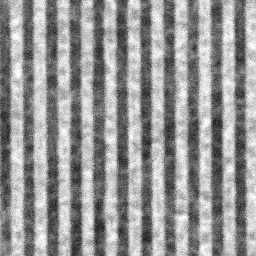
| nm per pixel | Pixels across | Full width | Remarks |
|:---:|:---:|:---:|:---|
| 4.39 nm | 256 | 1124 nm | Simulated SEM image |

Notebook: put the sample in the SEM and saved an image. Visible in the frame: parallel lines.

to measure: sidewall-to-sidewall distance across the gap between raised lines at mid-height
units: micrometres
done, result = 0.0592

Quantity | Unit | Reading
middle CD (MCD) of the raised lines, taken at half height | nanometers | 43.9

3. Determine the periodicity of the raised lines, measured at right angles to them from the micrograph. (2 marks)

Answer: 103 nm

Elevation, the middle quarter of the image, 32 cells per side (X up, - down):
X----XX---XXX---XXX---XXX---XXX-
X----XX---XXX---XXX---XXX---XXX-
X----XX---XXX---XXX---XXX---XXX-
X----XX---XXX---XXX---XXX---XXX-
X----XX---XXX---XXX---XXX---XXX-
X----XX---XXX---XXX---XXX---XXX-
X----XX---XXX---XXX---XXX---XXX-
X----XX---XXX---XXX---XXX---XXX-
X----XX---XXX---XXX---XXX---XXX-
X----XX---XXX---XXX---XXX---XXX-
X----XX---XXX---XXX---XXX---XXX-
X----XX---XXX---XXX---XXX---XXX-
X----XX----XX---XXX---XXX---XXX-
X----XX----XX---XXX---XXX---XX--
X----XX----XX---XXX---XXX---XX--
X----XX----XX---XXX---XXX---XX--
X----XX----XX---XXX---XXX---XX--
X----XX----XX---XXX---XXX---XX--
X----XX----XX---XXX---XXX---XX--
X----XX----XX---XXX---XXX---XX--
X----XX----XX---XXX---XXX---XX--
X----XX----XX---XXX---XXX---XX--
X----XX----XX---XXX---XXX---XX--
X----XX----XX---XXX---XXX---XXX-
X----XX----XX---XXX---XXX---XXX-
X----XX----XX---XXX---XXX---XXX-
X----XX----XX---XXX---XXX---XXX-
X----XX-X--XX---XXX---XXX---XXX-
X----XX----XX---XXX---XXX---XXX-
X----XX----XX---XXX---XXX---XXX-
X----XX----XX---XXX---XXX---XXX-
X----XX----XX---XXX---XXX---XXX-